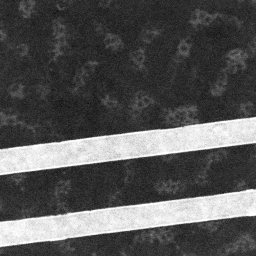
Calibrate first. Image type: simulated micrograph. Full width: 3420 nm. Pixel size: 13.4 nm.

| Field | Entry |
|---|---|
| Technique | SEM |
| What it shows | one or a few lines or trenches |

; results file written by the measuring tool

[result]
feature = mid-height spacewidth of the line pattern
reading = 643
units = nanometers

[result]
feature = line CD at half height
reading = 310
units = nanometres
